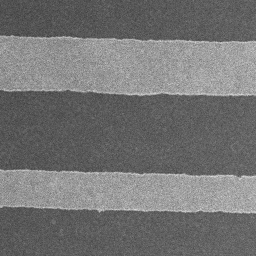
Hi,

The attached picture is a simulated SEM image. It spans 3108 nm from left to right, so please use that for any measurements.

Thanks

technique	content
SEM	one or a few lines or trenches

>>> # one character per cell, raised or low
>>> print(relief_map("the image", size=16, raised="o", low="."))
................
................
oooooooo........
oooooooooooooooo
oooooooooooooooo
oooooooooooooooo
................
................
................
................
................
oooooooooooooooo
oooooooooooooooo
................
................
................